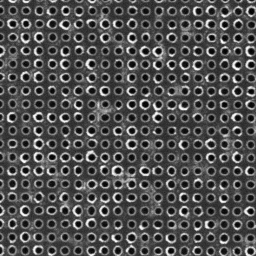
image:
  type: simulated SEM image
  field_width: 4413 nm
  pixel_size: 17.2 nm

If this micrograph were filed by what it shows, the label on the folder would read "a regular array of holes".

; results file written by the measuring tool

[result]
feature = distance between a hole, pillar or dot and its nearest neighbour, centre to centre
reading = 223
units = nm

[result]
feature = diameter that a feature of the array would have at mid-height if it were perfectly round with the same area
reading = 122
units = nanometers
